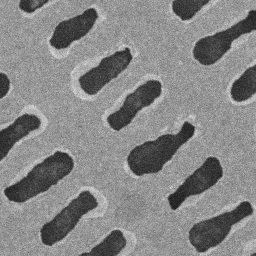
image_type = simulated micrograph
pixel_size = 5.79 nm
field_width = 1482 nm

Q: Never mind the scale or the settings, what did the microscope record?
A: holes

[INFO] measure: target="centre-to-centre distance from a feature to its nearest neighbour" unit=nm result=284